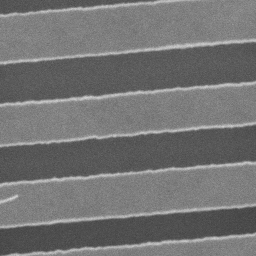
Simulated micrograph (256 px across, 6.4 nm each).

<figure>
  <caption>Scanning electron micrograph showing lines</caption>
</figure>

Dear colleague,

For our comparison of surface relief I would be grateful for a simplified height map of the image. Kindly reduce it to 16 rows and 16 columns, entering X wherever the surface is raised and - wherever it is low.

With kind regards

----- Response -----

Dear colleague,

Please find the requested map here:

-----XXXXXXXXXXX
XXXXXXXXXXXXXXXX
XXXXXXXXXXXXXXXX
XXXXXX----------
----------------
-----------XXXXX
XXXXXXXXXXXXXXXX
XXXXXXXXXXXXXXXX
XXXXXXXX--------
----------------
-----------XXXXX
XXXXXXXXXXXXXXXX
XXXXXXXXXXXXXXXX
XXXXXXXX--------
----------------
-----XXXXXXXXXXX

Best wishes